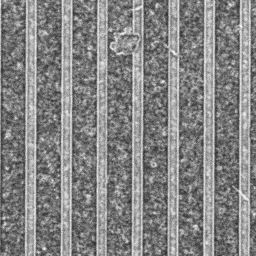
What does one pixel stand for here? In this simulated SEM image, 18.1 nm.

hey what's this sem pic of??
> parallel lines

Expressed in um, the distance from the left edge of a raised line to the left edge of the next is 0.643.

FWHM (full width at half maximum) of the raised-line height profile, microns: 0.487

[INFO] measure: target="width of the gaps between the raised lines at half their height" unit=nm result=153